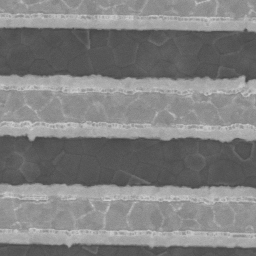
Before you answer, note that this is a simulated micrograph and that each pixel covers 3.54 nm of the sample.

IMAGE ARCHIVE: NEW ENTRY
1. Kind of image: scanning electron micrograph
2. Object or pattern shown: one or a few lines or trenches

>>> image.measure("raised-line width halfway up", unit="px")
47.3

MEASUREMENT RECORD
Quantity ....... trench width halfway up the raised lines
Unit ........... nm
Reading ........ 214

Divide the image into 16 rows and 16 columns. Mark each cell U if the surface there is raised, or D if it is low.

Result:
UUUUUUUUUUUUUUUU
DDDDDDDDDDDDUUUU
DDDDDDDDDDDDDDDD
DDDDDDDDDDDDDDDD
DDDDDDDDDDDDDDDD
UUUUUUUUUUUUUUUU
UUUUUUUUUUUUUUUU
UUUUUUUUUUUUUUUU
DDDDDDDDDDDDDDDD
DDDDDDDDDDDDDDDD
DDDDDDDDDDDDDDDD
DDDDDDDDDDDDDDDD
UUUUUUUUUUUUUUUU
UUUUUUUUUUUUUUUU
UUUUUUUUUUUUUUUU
DDDDDDDDDDDDDDDD